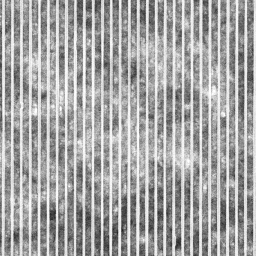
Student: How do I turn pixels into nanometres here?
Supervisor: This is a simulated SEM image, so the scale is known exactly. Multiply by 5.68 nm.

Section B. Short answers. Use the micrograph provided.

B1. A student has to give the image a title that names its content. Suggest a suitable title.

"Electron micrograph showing parallel lines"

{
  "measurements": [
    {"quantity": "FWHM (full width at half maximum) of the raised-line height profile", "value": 0.0106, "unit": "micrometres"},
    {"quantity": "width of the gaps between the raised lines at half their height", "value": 41.2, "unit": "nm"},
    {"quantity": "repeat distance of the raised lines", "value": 51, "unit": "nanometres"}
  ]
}